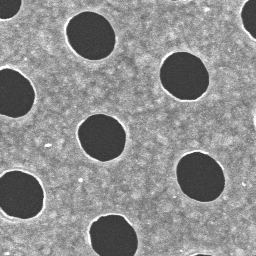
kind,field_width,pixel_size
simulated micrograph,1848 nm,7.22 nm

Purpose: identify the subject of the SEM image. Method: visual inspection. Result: holes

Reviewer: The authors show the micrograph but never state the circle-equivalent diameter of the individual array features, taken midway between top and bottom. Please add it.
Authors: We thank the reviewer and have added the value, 0.352 micrometres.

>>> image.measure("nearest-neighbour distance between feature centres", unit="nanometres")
737